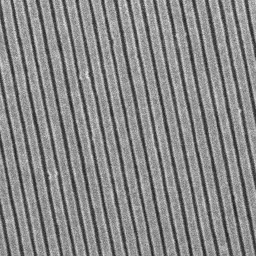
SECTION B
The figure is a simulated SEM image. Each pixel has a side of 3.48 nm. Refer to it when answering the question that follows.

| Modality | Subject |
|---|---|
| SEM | parallel lines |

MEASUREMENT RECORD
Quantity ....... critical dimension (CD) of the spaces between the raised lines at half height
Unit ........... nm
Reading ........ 13.2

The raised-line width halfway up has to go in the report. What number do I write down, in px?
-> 8.48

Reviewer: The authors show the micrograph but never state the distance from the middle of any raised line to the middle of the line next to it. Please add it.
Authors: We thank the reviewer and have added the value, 44.4 nanometres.